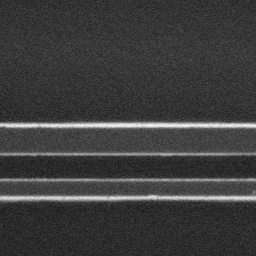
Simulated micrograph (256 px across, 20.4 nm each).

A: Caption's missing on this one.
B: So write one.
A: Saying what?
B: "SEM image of lines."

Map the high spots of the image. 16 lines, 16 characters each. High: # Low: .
................
................
................
................
................
................
................
................
################
################
################
################
................
................
................
................